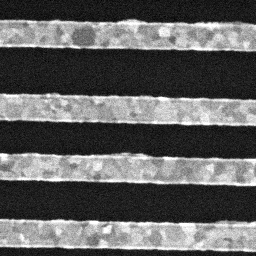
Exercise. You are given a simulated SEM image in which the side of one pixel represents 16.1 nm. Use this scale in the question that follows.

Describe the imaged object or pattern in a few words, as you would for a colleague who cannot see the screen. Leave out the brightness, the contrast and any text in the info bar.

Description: lines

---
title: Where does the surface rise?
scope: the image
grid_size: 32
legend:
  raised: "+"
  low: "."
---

................................
................................
................................
++++++++++++++++++++++++++++++++
++++++++++++++++++++++++++++++++
++++++++++++++++++++++++++++++++
................................
................................
................................
................................
................................
................................
++++++++++++++++++++++++++++++..
++++++++++++++++++++++++++++++++
++++++++++++++++++++++++++++++++
............................++++
................................
................................
................................
+++++++.........................
++++++++++++++++++++++++++++++++
++++++++++++++++++++++++++++++++
.....+++++++++++++++++++++++++++
................................
................................
................................
................................
................................
++++++++++++++++++++++++++++++++
++++++++++++++++++++++++++++++++
++++++++++++++++++++++++++++++++
................................